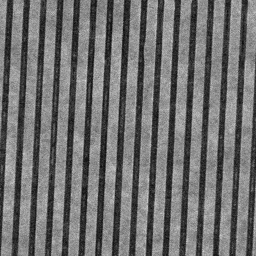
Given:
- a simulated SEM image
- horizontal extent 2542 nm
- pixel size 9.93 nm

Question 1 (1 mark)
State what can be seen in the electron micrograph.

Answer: parallel lines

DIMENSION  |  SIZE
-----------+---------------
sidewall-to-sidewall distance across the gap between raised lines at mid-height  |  0.0657 µm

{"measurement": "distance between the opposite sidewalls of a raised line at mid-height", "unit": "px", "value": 10.1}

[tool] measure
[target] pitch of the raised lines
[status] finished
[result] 166 nm